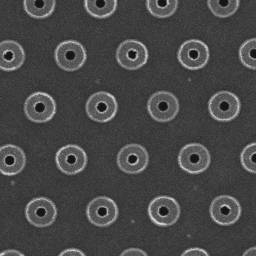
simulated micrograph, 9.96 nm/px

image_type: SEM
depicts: a regular array of ring-shaped raised bodies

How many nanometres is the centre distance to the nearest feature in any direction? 601